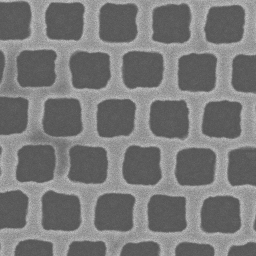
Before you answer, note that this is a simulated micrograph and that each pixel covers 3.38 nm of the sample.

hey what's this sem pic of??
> a regular array of holes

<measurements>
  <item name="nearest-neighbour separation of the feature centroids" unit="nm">180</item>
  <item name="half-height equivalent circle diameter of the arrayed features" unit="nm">140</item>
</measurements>